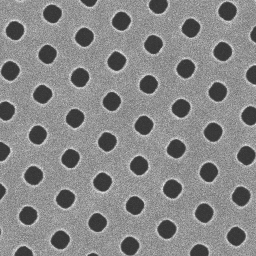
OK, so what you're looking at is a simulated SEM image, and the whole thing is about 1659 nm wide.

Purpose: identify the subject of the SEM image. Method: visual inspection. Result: a regular array of holes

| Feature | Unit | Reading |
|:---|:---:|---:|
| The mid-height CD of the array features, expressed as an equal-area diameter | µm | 0.118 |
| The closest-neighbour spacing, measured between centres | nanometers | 258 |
